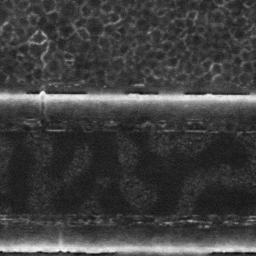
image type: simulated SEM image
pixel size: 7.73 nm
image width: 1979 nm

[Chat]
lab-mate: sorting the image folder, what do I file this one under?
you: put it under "one or a few lines or trenches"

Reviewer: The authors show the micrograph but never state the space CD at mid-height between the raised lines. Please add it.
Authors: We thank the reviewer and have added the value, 1160 nanometers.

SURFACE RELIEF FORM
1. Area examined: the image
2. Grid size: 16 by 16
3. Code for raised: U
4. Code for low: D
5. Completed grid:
UUUUUUUUUUUUUUUU
UUUUUUUUUUUUUUUU
UUUUUUUUUUUUUUUU
UUUUUUUUUUUUUUUU
UUUUUUUUUUUUUUUU
UUUUUUUUUUUUUUUU
DDDDDDDDDDDDDDDD
DDDDDDDDDDDDDDDD
DDDDDDDDDDDDDDDD
DDDDDDDDDDDDDDDD
DDDDDDDDDDDDDDDD
DDDDDDDDDDDDDDDD
DDDDDDDDDDDDDDDD
DDDDDDDDDDDDDDDD
DDDDDDDDDDDDDDDD
DDDUDDDDDDDDDDDD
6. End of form